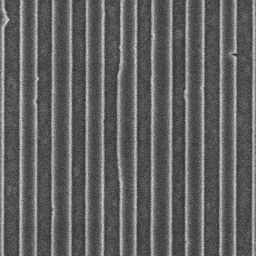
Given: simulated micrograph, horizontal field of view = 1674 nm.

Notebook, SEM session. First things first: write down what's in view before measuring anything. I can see parallel lines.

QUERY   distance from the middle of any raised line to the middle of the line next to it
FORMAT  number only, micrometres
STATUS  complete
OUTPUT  0.217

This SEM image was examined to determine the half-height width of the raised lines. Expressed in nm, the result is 116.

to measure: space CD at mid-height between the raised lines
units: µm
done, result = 0.103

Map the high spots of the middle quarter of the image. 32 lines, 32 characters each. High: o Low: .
oo....oooo....oooo....ooooo....o
oo....oooo....oooo....ooooo....o
oo....oooo....oooo....ooooo....o
oo....oooo....oooo....ooooo....o
oo....oooo....oooo....ooooo....o
oo....oooo....oooo....ooooo....o
oo....oooo....oooo....ooooo...oo
oo....oooo....oooo....ooooo...oo
oo....oooo....oooo....ooooo...oo
oo....oooo....oooo....ooooo....o
oo....oooo....oooo....ooooo....o
oo....oooo....oooo....ooooo....o
oo....oooo....oooo....ooooo....o
oo....oooo....oooo....ooooo....o
oo....oooo....oooo....ooooo....o
o.....oooo....oooo....ooooo....o
oo....oooo....oooo....ooooo....o
oo....oooo....oooo....ooooo....o
oo....oooo....oooo....ooooo....o
oo....oooo....oooo....ooooo....o
oo....oooo....oooo....ooooo....o
oo....oooo....oooo....ooooo....o
oo....oooo....oooo....ooooo....o
oo....oooo....oooo....ooooo....o
oo....oooo....oooo....ooooo....o
oo....oooo....oooo....ooooo....o
o.....oooo....oooo....ooooo....o
oo....oooo....oooo....ooooo....o
oo....oooo....oooo....ooooo....o
oo....oooo....oooo....ooooo....o
oo....oooo....oooo....ooooo....o
oo....oooo....oooo....ooooo....o